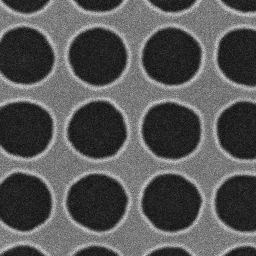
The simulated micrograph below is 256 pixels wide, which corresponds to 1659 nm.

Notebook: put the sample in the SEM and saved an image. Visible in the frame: holes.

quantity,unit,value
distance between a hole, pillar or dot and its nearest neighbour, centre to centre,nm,468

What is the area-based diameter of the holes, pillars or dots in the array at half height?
386 nm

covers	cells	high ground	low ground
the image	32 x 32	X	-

X-----XXXX-----XXXX-----XXXX----
XX---XXXXXX--XXXXXXXX-XXXXXXXX--
XXXXXXXXXXXXXXXXXXXXXXXXXXXXXXXX
XX--XXXXXXX--XXXXXXX--XXXXXXXX-X
------XXXX-----XXXX-----XXXX----
------XXX-------XX-------XX-----
-------XX-------XX-------XX-----
-------XX-------XX-------XX-----
-------XX-------XX-------XX-----
------XXXX-----XXXX-----XXXX----
XX--XXXXXXX---XXXXXX---XXXXXXX--
XXXXXXXXXXXXXXXXXXXXXXXXXXXXXXXX
XXXXXXXXXXXX-XXXXXXXXXXXXXXXXXXX
-----XXXXX-----XXXX-----XXXX----
------XXX------XXX-------XX-----
-------XX-------XX-------XX-----
-------X--------XX-------XX-----
------XXX-------XX-------XX-----
------XXX------XXXX------XXX----
XX---XXXXXX---XXXXXX---XXXXXX---
XXXXXXXXXXXXXXXXXXXXXXXXXXXXXXXX
XXXXXXXXXXXXXXXXXXXXXXXXXXXXXXXX
-----XXXXX-----XXXX-----XXXX----
------XXX------XXX-------XX-----
------XX--------XX-------XX-----
-------X--------XX-------XX-----
------XXX-------XX-------XX-----
------XXX------XXXX-----XXXX----
X---XXXXXXX---XXXXX----XXXXXX---
XXXXXXXXXXXXXXXXXXXXXXXXXXXXXXXX
XXXXXXXXXXXXXXXXXXXXXXXXXXXXXXXX
-----XXXX-----XXXXX-----XXXX----